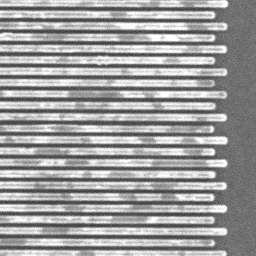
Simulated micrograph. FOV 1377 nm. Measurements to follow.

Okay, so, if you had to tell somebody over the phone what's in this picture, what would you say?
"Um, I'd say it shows parallel lines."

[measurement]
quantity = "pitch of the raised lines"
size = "11.4 px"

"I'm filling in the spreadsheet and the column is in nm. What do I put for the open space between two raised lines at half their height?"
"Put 25.9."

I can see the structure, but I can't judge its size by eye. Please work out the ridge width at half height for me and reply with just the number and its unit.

35.6 nanometres